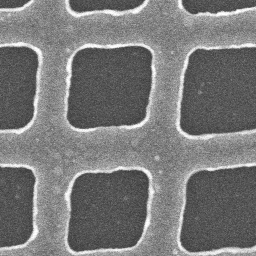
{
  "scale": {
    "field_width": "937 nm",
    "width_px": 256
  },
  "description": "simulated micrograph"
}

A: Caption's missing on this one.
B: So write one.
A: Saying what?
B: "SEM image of holes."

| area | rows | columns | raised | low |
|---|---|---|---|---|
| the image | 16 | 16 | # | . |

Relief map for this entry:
.###....####....
################
################
..###....###....
..##......##....
..##.....##.....
..##.....##.....
..##.....##.....
################
################
..#############.
..###....###....
..##.....###....
..##.....##.....
..##.....##.....
####....####....